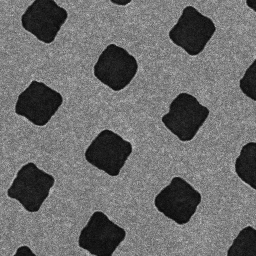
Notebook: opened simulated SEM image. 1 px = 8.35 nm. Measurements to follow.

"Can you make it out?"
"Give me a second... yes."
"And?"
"holes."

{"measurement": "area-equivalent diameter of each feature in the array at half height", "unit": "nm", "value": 355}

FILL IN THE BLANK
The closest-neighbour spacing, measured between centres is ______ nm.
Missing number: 706